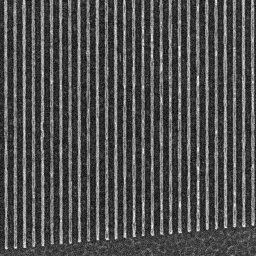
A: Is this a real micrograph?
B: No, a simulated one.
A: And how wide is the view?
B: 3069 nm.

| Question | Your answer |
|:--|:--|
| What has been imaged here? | parallel lines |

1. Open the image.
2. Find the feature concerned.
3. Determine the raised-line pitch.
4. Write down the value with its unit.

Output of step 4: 110 nm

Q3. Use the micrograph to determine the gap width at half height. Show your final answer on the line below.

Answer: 85.4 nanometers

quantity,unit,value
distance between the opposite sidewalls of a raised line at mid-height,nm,28.5